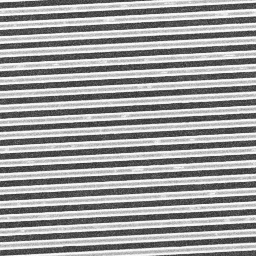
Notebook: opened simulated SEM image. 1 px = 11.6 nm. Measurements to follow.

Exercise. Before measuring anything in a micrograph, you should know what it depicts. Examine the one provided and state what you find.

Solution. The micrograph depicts parallel lines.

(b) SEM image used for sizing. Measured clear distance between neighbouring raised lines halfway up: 96.7 nm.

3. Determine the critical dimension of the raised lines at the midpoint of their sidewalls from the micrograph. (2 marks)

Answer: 67.8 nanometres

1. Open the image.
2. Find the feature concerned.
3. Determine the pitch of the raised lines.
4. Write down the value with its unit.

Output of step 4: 159 nm